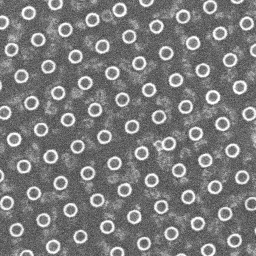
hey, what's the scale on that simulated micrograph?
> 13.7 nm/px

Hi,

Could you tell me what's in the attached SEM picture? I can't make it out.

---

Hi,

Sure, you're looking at a regular array of raised bodies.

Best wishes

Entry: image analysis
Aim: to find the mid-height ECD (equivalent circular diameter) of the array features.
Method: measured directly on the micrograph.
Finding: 0.168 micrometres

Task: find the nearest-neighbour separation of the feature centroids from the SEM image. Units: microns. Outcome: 0.389